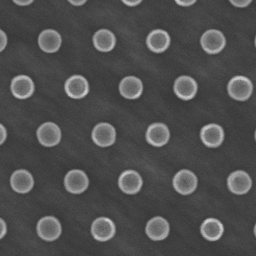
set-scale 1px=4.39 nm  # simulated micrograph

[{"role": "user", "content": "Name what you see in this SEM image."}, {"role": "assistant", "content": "a regular array of raised bodies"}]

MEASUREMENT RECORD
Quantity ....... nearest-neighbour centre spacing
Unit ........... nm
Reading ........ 238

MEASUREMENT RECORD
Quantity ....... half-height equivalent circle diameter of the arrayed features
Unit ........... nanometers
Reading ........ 102